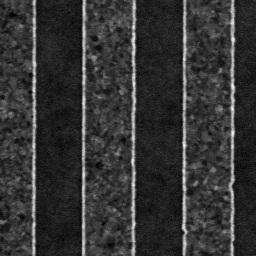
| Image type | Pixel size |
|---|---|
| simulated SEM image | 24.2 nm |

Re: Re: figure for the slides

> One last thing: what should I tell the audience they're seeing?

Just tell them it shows one or a few lines or trenches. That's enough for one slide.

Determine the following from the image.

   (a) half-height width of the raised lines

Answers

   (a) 1180 nanometers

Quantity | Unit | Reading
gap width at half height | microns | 1.22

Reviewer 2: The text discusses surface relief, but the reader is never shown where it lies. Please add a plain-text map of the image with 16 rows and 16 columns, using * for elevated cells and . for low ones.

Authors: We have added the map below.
**...***....***.
**...***....***.
**...***....***.
**...***...****.
**...***...***..
**...***....***.
**...***....***.
**...***...****.
**...***....***.
**...***....***.
**...***...****.
**...***....**..
**...***....***.
**...***....***.
**...***....***.
**...***....**..